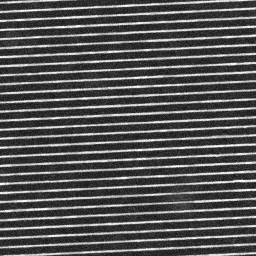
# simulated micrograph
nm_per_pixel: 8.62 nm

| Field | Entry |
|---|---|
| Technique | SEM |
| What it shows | parallel lines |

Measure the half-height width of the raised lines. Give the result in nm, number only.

12.9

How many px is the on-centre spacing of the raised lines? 9.05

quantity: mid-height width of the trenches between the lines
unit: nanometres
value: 63.5